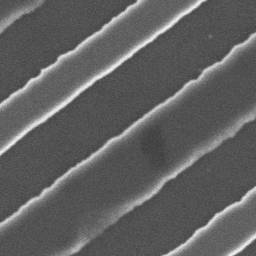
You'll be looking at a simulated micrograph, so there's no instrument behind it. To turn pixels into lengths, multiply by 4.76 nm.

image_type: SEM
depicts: lines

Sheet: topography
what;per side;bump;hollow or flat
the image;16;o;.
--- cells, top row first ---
oo......oooo....
.......oooo.....
.....oooo......o
....oooo......oo
...oooo......ooo
.oooo......ooooo
oooo......oooooo
ooo......oooooo.
o......ooooooo..
......ooooooo...
.....oooooo.....
...ooooooo......
..ooooooo......o
.oooooo......ooo
oooooo......oooo
ooooo......oooo.